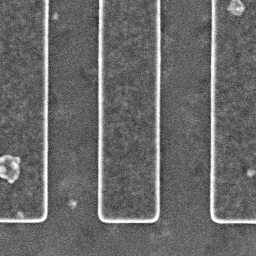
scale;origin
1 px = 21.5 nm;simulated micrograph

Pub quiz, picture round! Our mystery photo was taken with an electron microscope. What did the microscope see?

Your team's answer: wiring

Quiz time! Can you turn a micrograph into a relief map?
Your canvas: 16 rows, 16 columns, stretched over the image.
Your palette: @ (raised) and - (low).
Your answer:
@@@---@@@@---@@@
@@@---@@@@---@@@
@@@---@@@@---@@@
@@@---@@@@---@@@
@@@---@@@@---@@@
@@@---@@@@---@@@
@@@---@@@@---@@@
@@@---@@@@---@@@
@@@---@@@@---@@@
@@@---@@@@---@@@
@@@---@@@@---@@@
@@@---@@@@---@@@
@@@---@@@@---@@@
@@@---@@@@---@@@
----------------
----------------